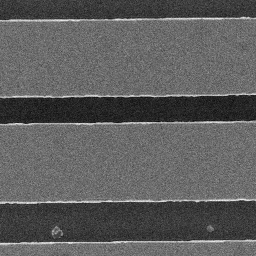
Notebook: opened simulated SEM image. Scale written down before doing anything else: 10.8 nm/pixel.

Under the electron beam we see lines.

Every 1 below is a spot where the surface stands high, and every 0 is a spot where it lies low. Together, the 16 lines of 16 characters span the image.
0000000000000000
1111111111111111
1111111111111111
1111111111111111
1111111111111111
1111111111111111
0000000000000000
0000000000000000
1111111111111111
1111111111111111
1111111111111111
1111111111111111
1111111111111111
0000000000000000
0000000000000000
1111111111111111